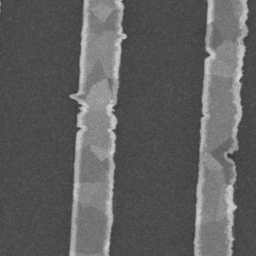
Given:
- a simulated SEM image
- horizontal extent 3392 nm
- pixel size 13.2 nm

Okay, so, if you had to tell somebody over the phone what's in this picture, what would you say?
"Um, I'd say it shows one or a few lines or trenches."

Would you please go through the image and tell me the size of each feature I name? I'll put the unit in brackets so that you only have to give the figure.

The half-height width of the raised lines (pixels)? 33.7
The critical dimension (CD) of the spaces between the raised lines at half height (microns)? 1.19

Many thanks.